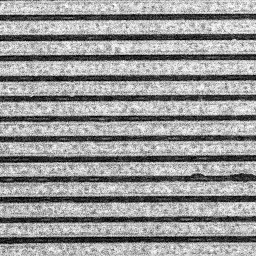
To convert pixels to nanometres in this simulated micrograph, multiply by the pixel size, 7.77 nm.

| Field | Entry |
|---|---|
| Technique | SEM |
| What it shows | parallel lines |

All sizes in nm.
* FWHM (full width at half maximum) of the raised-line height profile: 100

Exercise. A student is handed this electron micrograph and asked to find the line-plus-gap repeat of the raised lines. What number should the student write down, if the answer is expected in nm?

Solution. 157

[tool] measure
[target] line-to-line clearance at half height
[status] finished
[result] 61.2 nm